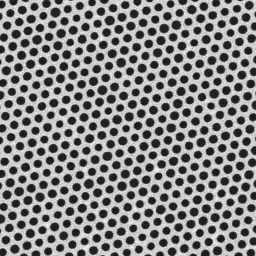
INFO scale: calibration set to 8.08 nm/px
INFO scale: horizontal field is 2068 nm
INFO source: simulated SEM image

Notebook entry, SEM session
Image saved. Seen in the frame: a regular array of holes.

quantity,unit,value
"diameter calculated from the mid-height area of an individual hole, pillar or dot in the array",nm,67.6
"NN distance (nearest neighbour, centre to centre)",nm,99.7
